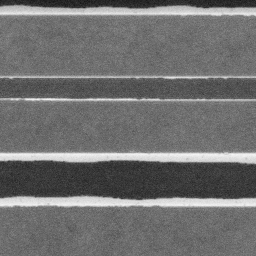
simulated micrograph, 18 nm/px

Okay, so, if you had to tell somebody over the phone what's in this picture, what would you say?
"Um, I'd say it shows lines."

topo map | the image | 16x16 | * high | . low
................
****************
****************
****************
****************
****************
****************
****************
****************
****************
................
................
................
****************
****************
****************